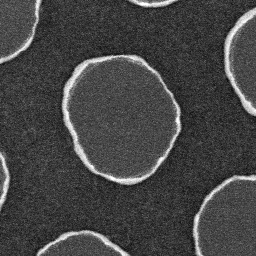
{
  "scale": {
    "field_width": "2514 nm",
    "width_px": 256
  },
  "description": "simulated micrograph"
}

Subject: raised bodies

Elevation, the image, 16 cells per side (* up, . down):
**..............
**.............*
**............**
*......*......**
.....*****....**
....******.....*
....*******....*
....*******.....
.....******.....
.....******.....
......****......
..............**
.............***
............****
.....*......****
...****.....****